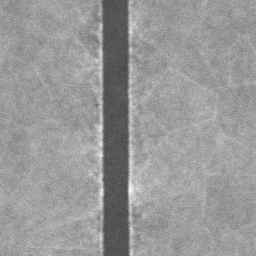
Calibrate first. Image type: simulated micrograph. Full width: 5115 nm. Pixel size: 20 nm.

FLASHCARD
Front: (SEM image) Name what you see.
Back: one or a few lines or trenches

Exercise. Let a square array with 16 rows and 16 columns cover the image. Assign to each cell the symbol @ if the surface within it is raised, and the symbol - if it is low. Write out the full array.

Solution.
@@@@@@--@@@@@@@@
@@@@@@--@@@@@@@@
@@@@@@--@@@@@@@@
@@@@@@--@@@@@@@@
@@@@@@--@@@@@@@@
@@@@@@--@@@@@@@@
@@@@@@--@@@@@@@@
@@@@@@--@@@@@@@@
@@@@@@--@@@@@@@@
@@@@@@--@@@@@@@@
@@@@@@--@@@@@@@@
@@@@@@--@@@@@@@@
@@@@@@--@@@@@@@@
@@@@@@--@@@@@@@@
@@@@@@--@@@@@@@@
@@@@@@--@@@@@@@@